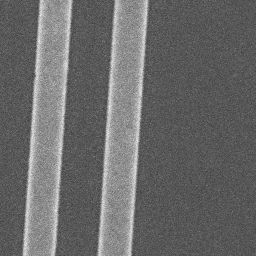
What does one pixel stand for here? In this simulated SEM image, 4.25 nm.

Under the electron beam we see one or a few lines or trenches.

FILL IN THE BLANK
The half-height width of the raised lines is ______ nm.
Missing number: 135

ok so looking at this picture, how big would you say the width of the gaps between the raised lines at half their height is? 184 nanometers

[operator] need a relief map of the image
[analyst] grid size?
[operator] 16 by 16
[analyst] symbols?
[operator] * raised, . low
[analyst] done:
..**...**.......
..**...**.......
..**...**.......
..**...**.......
..**...**.......
..**...**.......
..**...**.......
..**...**.......
..**...**.......
..**...**.......
..**...**.......
..**..**........
..**..**........
..**..**........
..**..**........
.**...**........